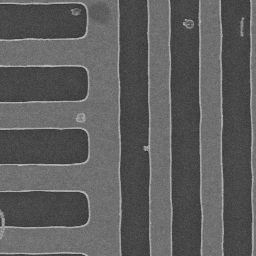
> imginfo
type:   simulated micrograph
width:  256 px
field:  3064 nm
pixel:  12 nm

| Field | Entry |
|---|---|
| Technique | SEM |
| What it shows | groups of lines, slits or small figures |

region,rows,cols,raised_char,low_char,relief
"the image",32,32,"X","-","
----------XXXXX---XXX----XX----X
-----------XXXX----XX----XX----X
-----------XXXX----XX----XXX---X
-----------XXXX----XX----XXX---X
----------XXXXX----XX----XXX---X
XXXXXXXXXXXXXXX----XX----XXX---X
XXXXXXXXXXXXXXX----XX----XXX---X
XXXXXXXXXXXXXXX----XX----XXX---X
-----------XXXX----XX----XXX---X
-----------XXXX----XX----XXX---X
-----------XXXX----XX----XXX---X
-----------XXXX----XX----XXX---X
----------XXXXX----XX----XXX---X
XXXXXXXXXXXXXXX----XX----XXX---X
XXXXXXXXXXXXXXX----XX----XXX---X
XXXXXXXXXXXXXXX----XX----XXX---X
-----------XXXX----XX----XXX----
-----------XXXX----XX----XXX----
-----------XXXX----XX----XXX---X
-----------XXXX----XX----XXX---X
----------XXXXX----XX----XXX---X
XXXXXXXXXXXXXXX----XX----XXX----
XXXXXXXXXXXXXXX----XX----XXX----
XXXXXXXXXXXXXXX----XX----XXX----
-----------XXXX----XX----XXX----
-----------XXXX----XX----XXX----
-----------XXXX----XX----XXX----
-----------XXXX----XX----XXX----
XX----XX-XXXXXX----XX----XXX----
XXXXXXXXXXXXXXX----XX----XXX----
XXXXXXXXXXXXXXX----XX----XXX----
XXXXXXXXXXXXXXX----XX----XXX----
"